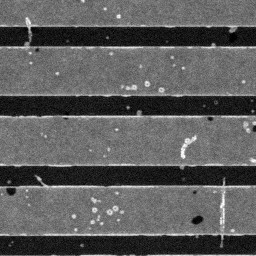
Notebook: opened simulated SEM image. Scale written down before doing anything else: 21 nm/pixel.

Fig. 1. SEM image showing lines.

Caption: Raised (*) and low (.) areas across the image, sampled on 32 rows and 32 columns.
********************************
********************************
********************************
................................
................................
................................
********************************
********************************
********************************
********************************
********************************
********************************
................................
................................
................................
********************************
********************************
********************************
********************************
********************************
********************************
................................
................................
********************************
********************************
********************************
********************************
********************************
********************************
................................
................................
................................